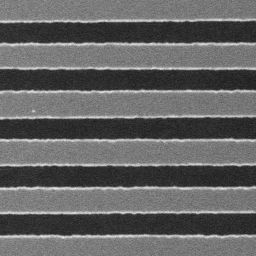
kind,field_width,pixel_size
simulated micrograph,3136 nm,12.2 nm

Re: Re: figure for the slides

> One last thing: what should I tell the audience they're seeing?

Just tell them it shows lines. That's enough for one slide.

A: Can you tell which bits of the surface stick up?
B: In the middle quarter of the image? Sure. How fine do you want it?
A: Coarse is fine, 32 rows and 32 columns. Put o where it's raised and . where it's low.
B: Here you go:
oooooooooooooooooooooooooooooooo
................................
................................
................................
................................
................................
................................
oooooooooooooooooooooooooooooooo
oooooooooooooooooooooooooooooooo
oooooooooooooooooooooooooooooooo
oooooooooooooooooooooooooooooooo
oooooooooooooooooooooooooooooooo
oooooooooooooooooooooooooooooooo
................................
................................
................................
................................
................................
................................
oooooooooooooooooooooooooooooooo
oooooooooooooooooooooooooooooooo
oooooooooooooooooooooooooooooooo
oooooooooooooooooooooooooooooooo
oooooooooooooooooooooooooooooooo
oooooooooooooooooooooooooooooooo
................................
................................
................................
................................
................................
................................
oooooooooooooooooooooooooooooooo